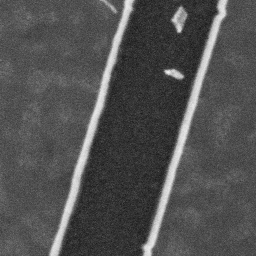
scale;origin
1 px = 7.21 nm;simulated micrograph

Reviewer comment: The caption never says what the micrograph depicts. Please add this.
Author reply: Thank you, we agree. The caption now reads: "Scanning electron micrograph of one or a few lines or trenches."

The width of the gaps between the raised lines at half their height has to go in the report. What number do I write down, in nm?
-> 631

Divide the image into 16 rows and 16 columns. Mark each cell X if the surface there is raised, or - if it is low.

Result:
XXXXXXXX------XX
XXXXXXXX-----XXX
XXXXXXX------XXX
XXXXXXX------XXX
XXXXXXX------XXX
XXXXXXX-----XXXX
XXXXXX------XXXX
XXXXXX------XXXX
XXXXXX-----XXXXX
XXXXX------XXXXX
XXXXX------XXXXX
XXXXX-----XXXXXX
XXXXX-----XXXXXX
XXXX------XXXXXX
XXXX------XXXXXX
XXXX-----XXXXXXX